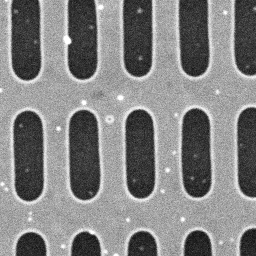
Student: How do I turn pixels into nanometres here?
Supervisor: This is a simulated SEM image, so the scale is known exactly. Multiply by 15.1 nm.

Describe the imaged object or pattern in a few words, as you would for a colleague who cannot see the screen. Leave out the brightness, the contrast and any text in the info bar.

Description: groups of lines, slits or small figures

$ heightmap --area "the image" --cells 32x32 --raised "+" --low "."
+....+++....+++....+++....+++...
+....+++....+++....+++....+++...
+....+++....+++....+++....+++...
+....+++....+++....+++....+++...
+....++++...+++....+++....+++...
+....++++...+++....+++....+++...
+....+++....+++....+++....+++...
+....+++....+++....+++....+++...
+....++++...++++...++++...++++..
++...++++...++++..++++++.++++++.
++++++++++++++++++++++++++++++++
++++++++++++++++++++++++++++++++
++++++++++++++++++++++++++++++++
++++++++++++++++++++++++.++++++.
++...++++...++++...++++...++++..
++...++++...++++...++++...++++..
++...++++...++++...++++...++++..
++....+++...++++...++++...++++..
++....+++...++++...++++...++++..
++....+++...++++....+++...++++..
++....+++....+++....+++...++++..
++....+++....+++....+++....+++..
++....+++....+++....+++....+++..
++...++++...++++...++++...++++..
++...++++...+++++..+++++..+++++.
++++++++++++++++++++++++++++++++
++++++++++++++++++++++++++++++++
++++++++++++++++++++++++++++++++
++++++++++++++++++++++++++++++++
+++..++++...++++...++++...++++..
++....+++...++++....+++...++++..
++....+++....+++....+++....+++..